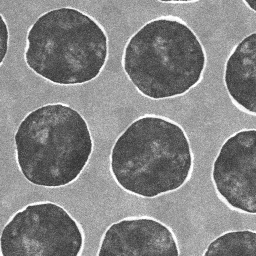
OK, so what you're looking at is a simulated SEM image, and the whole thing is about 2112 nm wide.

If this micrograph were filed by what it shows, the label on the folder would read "holes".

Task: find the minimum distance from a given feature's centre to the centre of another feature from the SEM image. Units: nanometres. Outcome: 814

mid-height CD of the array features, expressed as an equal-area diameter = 651 nm